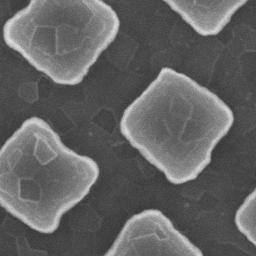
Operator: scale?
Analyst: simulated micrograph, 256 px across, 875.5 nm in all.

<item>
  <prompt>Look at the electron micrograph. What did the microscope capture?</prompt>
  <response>raised bodies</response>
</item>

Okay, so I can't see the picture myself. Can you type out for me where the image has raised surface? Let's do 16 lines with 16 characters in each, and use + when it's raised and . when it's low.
..+++++....++++.
.++++++.....++..
.++++++.........
..++++..........
...++.....+.....
.........++++...
........++++++..
........++++++..
.++.....++++++..
++++.....++++...
++++++....+++...
++++++..........
+++++..........+
.+++.....+.....+
........+++....+
.......+++++....